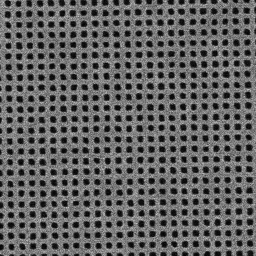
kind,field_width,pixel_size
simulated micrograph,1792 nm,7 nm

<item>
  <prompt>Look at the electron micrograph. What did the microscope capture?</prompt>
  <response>a regular array of holes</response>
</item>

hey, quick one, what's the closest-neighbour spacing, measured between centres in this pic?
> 10.3 px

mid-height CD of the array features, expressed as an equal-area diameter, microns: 0.044